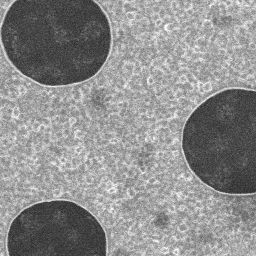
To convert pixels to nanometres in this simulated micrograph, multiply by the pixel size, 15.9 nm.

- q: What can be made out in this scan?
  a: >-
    holes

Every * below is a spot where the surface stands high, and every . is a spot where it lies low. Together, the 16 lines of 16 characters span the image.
*.....**********
.......*********
.......*********
.......*********
*.....**********
****************
*************...
************....
***********.....
***********.....
************....
*************...
****************
*.....**********
*......*********
.......*********